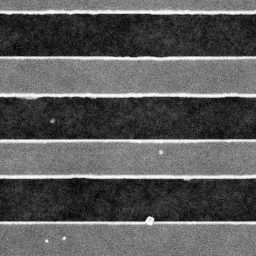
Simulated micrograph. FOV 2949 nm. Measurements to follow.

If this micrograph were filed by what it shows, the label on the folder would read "lines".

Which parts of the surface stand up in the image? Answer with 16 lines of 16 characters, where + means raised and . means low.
++++++++++++++++
................
................
................
++++++++++++++++
++++++++++++++++
................
................
................
++++++++++++++++
++++++++++++++++
................
................
................
++++++++++++++++
++++++++++++++++